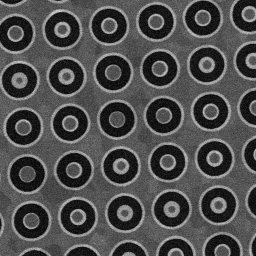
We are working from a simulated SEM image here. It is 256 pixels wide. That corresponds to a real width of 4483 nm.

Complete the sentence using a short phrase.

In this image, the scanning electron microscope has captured an array of small figures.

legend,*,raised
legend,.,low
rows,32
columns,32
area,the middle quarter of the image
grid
....****....*....**...***....**.
.....***...***...**...****...**.
**...***...***...**....**...****
**...***...***...***........****
*....***........*****......*****
.....****.......******....******
....******....******************
...*****************************
***********************...******
************...*******......****
...*******.......****........***
.....****........***....**....**
......***...***...**...****...**
**....***..****...**...****...**
***...***...***...**....**...***
***...***...**....***........***
.*....***........*****......****
.....*****......********..******
....********..******************
*.******************************
************************....****
************.....******......***
*....******.......****........**
......****........***....**....*
.......***...***...**...****...*
.***...**....***...**...***....*
.***...***...**....***........**
.***...***........****........**
.......****.......*****......***
......******.....***************
.....***************************
**************************.*****